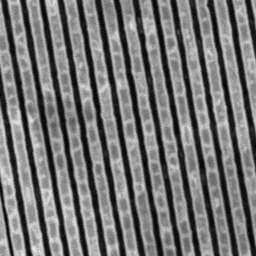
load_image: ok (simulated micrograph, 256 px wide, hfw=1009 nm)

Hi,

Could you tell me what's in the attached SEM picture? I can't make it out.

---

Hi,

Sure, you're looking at parallel lines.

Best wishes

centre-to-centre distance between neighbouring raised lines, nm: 72.8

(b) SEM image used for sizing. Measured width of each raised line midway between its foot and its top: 40.8 nm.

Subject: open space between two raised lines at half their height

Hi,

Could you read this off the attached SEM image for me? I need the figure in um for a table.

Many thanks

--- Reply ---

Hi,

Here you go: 0.0297